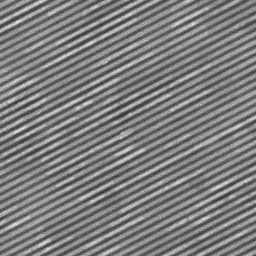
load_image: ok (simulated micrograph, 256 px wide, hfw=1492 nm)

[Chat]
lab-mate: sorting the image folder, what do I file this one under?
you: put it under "parallel lines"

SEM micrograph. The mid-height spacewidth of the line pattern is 4.22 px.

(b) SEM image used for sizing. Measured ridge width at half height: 3.33 pixels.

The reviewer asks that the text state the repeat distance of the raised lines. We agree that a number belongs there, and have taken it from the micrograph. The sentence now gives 0.0435 microns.